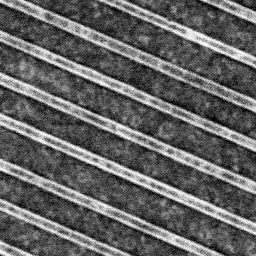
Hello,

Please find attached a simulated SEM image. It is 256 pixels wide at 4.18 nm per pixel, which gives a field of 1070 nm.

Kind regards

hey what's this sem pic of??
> parallel lines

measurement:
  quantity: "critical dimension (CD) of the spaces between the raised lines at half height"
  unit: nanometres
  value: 124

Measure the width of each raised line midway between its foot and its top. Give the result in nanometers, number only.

38.4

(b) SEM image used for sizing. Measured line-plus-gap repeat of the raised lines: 161 nanometres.